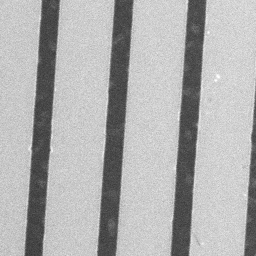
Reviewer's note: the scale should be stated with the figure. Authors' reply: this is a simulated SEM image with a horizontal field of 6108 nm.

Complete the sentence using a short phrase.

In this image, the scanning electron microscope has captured one or a few lines or trenches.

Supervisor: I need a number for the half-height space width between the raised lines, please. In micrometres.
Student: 1.25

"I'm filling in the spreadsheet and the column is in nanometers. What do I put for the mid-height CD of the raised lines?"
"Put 494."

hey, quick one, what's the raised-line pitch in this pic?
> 1.74 um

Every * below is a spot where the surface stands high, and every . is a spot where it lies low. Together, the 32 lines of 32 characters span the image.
.....***......***......***......
.....**.......***......***......
.....**.......***......***......
.....**.......***......***......
.....**.......**.......***......
.....**.......**.......***......
.....**.......**.......**.......
.....**.......**.......**.......
.....**.......**.......**.......
....***.......**.......**.......
....***......***.......**.......
....***......***.......**.......
....***......***.......**.......
....***......***......***.......
....***......***......***.......
....***......***......***.......
....***......***......***......*
....**.......***......***......*
....**.......***......***......*
....**.......**.......***......*
....**.......**.......**.......*
....**.......**.......**.......*
....**.......**.......**.......*
....**.......**.......**.......*
...***.......**.......**.......*
...***......***.......**.......*
...***......***.......**.......*
...***......***......***.......*
...***......***......***.......*
...***......***......***.......*
...**.......***......***......**
...**.......***......***......**